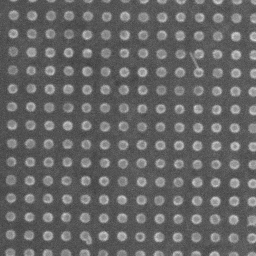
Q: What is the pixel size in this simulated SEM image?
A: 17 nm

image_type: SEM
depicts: a regular array of raised bodies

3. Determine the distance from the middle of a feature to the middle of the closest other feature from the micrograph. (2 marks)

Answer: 308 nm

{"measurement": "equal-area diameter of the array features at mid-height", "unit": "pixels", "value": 8.59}